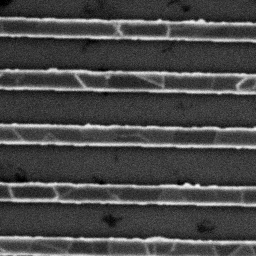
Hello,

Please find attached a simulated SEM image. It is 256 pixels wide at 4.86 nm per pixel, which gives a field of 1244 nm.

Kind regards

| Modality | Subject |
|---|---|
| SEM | lines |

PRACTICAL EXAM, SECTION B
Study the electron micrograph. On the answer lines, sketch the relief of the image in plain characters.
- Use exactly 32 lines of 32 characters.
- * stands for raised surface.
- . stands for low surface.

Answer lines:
................................
................................
*************...................
********************************
...*****************************
................................
................................
................................
................................
********************************
********************************
........................********
................................
................................
................................
................................
********************************
********************************
................................
................................
................................
................................
................................
********************************
********************************
........................********
................................
................................
................................
................................
********************************
********************************